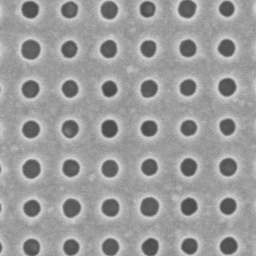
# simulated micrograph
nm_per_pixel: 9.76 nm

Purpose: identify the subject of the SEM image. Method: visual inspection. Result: a regular array of holes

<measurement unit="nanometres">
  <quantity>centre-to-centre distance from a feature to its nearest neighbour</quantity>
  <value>381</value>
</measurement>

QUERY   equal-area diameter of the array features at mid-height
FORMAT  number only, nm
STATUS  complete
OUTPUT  177